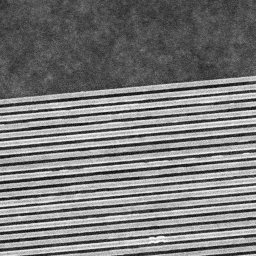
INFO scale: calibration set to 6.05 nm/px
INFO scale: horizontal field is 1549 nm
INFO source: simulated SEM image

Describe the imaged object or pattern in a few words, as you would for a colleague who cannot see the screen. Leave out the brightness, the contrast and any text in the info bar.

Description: parallel lines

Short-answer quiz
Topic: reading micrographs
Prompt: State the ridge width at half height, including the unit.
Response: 27.9 nm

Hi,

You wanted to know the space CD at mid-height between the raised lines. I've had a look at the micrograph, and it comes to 21.8 nm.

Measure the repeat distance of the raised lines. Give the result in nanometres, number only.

51.2